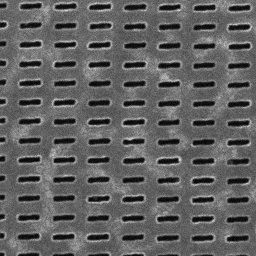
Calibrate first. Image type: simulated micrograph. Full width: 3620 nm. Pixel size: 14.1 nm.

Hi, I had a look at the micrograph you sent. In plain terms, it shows a regular array of holes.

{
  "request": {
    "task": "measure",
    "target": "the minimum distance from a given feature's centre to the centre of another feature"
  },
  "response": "269 nm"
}